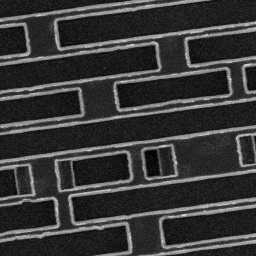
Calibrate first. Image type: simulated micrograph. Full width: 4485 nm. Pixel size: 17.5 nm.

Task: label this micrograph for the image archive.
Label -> parallel lines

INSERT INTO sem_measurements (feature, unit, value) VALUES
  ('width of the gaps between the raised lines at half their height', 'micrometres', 0.466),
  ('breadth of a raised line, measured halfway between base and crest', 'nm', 150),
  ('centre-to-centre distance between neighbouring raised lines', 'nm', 618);